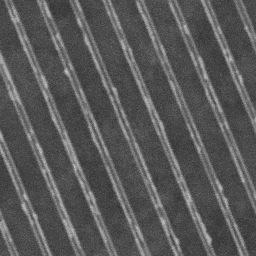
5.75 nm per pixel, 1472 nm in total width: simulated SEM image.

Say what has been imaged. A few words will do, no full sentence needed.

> parallel lines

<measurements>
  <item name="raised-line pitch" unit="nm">175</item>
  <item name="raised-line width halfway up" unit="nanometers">37.2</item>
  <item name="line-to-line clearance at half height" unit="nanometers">136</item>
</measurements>